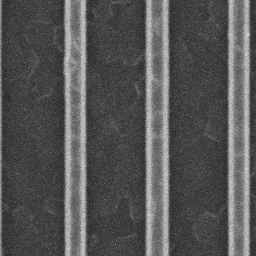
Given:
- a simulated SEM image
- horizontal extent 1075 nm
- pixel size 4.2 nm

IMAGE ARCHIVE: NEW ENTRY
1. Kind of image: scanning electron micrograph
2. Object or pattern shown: one or a few lines or trenches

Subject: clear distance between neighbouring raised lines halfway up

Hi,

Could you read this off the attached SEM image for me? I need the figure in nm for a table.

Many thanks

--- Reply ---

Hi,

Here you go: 273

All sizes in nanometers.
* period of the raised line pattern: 342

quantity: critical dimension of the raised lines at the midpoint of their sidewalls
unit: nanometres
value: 67.2